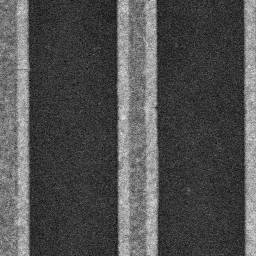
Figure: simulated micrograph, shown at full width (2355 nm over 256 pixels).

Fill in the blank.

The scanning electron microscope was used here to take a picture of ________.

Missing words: one or a few lines or trenches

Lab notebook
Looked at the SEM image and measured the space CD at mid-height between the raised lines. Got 935 nm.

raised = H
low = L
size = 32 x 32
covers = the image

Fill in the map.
HHHLLLLLLLLLLLLLHHHLLLLLLLLLLLLH
HHHLLLLLLLLLLLLLHHHLLLLLLLLLLLLH
HHHLLLLLLLLLLLLLHHHLLLLLLLLLLLLH
HHHLLLLLLLLLLLLLHHHLLLLLLLLLLLLH
HHHLLLLLLLLLLLLLHHHLLLLLLLLLLLLH
HHHLLLLLLLLLLLLLHHHLLLLLLLLLLLLH
HHHLLLLLLLLLLLLLHHHLLLLLLLLLLLLH
HHHLLLLLLLLLLLLLHHHLLLLLLLLLLLLH
HHHLLLLLLLLLLLLLHHHLLLLLLLLLLLLH
HHHLLLLLLLLLLLLLHHHLLLLLLLLLLLLH
HHHLLLLLLLLLLLLHHHHLLLLLLLLLLLLH
HHHLLLLLLLLLLLLLHHHLLLLLLLLLLLLH
HHHLLLLLLLLLLLLLHHHLLLLLLLLLLLLH
HHHLLLLLLLLLLLLLHHHLLLLLLLLLLLLH
HHHLLLLLLLLLLLLLHHHLLLLLLLLLLLLH
HHHLLLLLLLLLLLLHHHHLLLLLLLLLLLLH
HHHLLLLLLLLLLLLLHHHLLLLLLLLLLLLH
HHHLLLLLLLLLLLLLHHHLLLLLLLLLLLLH
HHHLLLLLLLLLLLLLHHHLLLLLLLLLLLLH
HHHLLLLLLLLLLLLLHHHLLLLLLLLLLLLH
HHHLLLLLLLLLLLLLHHHLLLLLLLLLLLLL
HHHLLLLLLLLLLLLLHHHLLLLLLLLLLLLL
HHHLLLLLLLLLLLLLHHHLLLLLLLLLLLLL
HHHLLLLLLLLLLLLLHHHLLLLLLLLLLLLL
HHHLLLLLLLLLLLLLHHHLLLLLLLLLLLLL
HHHLLLLLLLLLLLLLHHHLLLLLLLLLLLLL
HHHLLLLLLLLLLLLLHHHLLLLLLLLLLLLL
HHHLLLLLLLLLLLLLHHHLLLLLLLLLLLLL
HHHLLLLLLLLLLLLLHHHLLLLLLLLLLLLL
HHHLLLLLLLLLLLLLHHHLLLLLLLLLLLLL
HHHLLLLLLLLLLLLLHHHLLLLLLLLLLLLL
HHHLLLLLLLLLLLLLHHHLLLLLLLLLLLLL